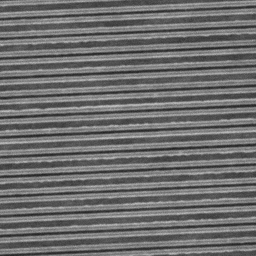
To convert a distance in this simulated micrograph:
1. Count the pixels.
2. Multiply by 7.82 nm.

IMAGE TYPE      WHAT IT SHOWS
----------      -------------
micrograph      parallel lines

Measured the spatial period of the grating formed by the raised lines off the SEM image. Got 76.9 nanometers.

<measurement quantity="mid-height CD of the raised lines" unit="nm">35.2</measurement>